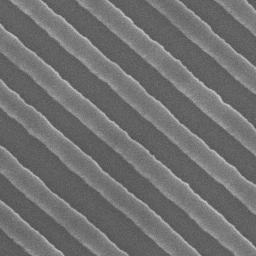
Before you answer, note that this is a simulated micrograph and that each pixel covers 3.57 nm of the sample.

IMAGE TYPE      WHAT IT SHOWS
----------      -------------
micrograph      lines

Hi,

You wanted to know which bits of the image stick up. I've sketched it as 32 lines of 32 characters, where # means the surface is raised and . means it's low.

..####....####.....####.....###.
...####.....###.....####.....###
....####.....###.....####.....##
......###.....###.....####.....#
##.....###.....###.....####.....
###.....####....####.....###....
####.....####....####.....####..
.####.....####....####.....####.
...####....####.....###.....####
....###.....####.....###.....###
#....####.....###.....###.....##
##....####.....###.....####.....
###....####.....####....####....
####....####.....####....####...
.####.....###.....####....####..
...###.....###.....####.....###.
....###.....####....####.....###
.....####....####.....###.....##
......####....####.....###.....#
##.....####.....###.....####....
###.....####.....###.....####...
####......###.....###.....####..
.####......###.....####....####.
..####......####....####....####
....###......####....####.....##
#....###......####....####.....#
##....####......###....####.....
###....####......###....####....
####....####......###....####...
.####....####......####....###..
...###.....###......###.....###.
....####....####.....####....###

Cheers